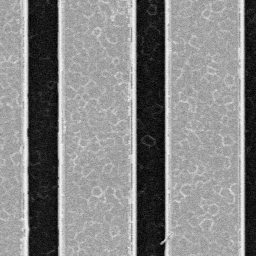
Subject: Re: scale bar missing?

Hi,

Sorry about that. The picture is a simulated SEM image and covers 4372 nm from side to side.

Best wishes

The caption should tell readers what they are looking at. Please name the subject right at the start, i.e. one or a few lines or trenches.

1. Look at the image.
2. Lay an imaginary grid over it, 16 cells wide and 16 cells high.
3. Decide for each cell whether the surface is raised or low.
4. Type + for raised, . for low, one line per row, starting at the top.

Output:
++..++++..+++++.
++..++++..+++++.
++..++++..+++++.
++..++++..+++++.
++..++++...++++.
++..++++...++++.
++..++++...++++.
++..++++..+++++.
++..++++...++++.
++..++++...++++.
++..++++...++++.
++..++++...++++.
++..++++...++++.
++..++++...++++.
++..++++..+++++.
++..++++..+++++.